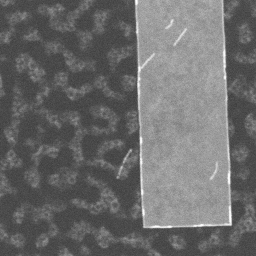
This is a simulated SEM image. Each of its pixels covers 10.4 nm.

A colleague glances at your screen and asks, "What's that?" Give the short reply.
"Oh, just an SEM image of one or a few lines or trenches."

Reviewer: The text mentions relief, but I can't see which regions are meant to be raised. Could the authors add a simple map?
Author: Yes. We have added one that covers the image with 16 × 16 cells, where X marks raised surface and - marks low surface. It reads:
---------XXXXX--
---------XXXXX--
---------XXXXX--
---------XXXXX--
---------XXXXX--
---------XXXXX--
---------XXXXX--
---------XXXXX--
---------XXXXX--
---------XXXXX--
---------XXXXX--
---------XXXXX--
---------XXXXX--
---------XXXXX--
----------------
----------------